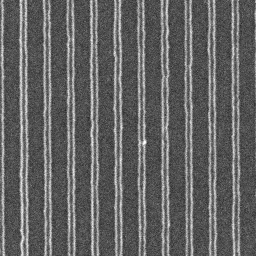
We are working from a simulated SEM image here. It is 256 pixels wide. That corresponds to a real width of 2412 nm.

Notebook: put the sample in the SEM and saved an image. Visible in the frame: parallel lines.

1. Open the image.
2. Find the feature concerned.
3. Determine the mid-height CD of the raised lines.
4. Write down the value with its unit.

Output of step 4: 54.2 nanometers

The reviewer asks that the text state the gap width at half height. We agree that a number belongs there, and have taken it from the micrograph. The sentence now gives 165 nm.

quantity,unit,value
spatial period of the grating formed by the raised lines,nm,222